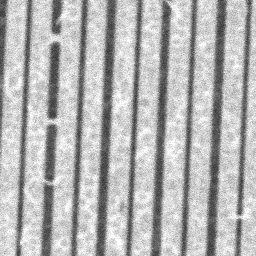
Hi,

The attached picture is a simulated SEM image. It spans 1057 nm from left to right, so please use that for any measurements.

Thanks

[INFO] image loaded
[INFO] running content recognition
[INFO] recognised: parallel lines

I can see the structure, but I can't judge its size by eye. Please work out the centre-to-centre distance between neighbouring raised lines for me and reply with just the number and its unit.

27.6 px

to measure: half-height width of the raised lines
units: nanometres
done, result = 76.3